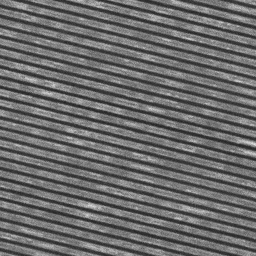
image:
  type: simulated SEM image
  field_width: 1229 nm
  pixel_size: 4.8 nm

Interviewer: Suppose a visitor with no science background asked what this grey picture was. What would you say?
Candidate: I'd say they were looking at parallel lines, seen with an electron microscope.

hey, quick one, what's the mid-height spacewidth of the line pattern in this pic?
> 17.5 nm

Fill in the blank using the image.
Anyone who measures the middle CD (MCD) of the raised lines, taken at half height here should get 0.0297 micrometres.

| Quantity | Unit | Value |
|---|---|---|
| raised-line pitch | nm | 47.3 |